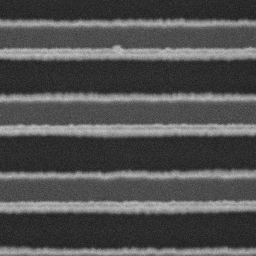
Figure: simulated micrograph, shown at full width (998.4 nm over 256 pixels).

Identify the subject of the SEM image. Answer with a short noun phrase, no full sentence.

lines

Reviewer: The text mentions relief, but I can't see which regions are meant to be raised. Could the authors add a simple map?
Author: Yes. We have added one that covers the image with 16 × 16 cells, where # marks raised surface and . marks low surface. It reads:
................
####.###########
################
##########.##.#.
................
................
################
################
................
................
................
################
################
................
................
................